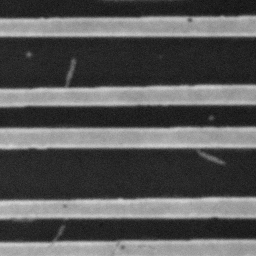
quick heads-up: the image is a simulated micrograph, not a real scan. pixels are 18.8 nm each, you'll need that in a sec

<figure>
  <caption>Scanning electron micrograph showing lines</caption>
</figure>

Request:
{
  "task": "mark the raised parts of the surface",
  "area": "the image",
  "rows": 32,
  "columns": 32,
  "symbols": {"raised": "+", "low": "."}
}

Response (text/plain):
................................
................................
.+++++++++++++++++++++++++++++++
++++++++++++++++++++++++++++++++
................................
................................
................................
................................
................................
................................
................................
++++++++++++++++++++++++++++++++
++++++++++++++++++++++++++++++++
................................
................................
................................
++++++++++++++++++++++++++++++++
++++++++++++++++++++++++++++++++
................................
................................
................................
................................
................................
................................
................................
++++++++++++++++++++++++++++++++
++++++++++++++++++++++++++++++++
................................
................................
................................
...+++++++++++++++++++++++++++++
++++++++++++++++++++++++++++++++